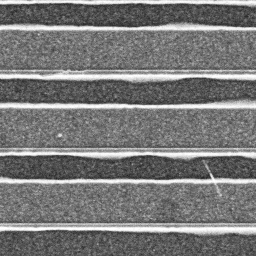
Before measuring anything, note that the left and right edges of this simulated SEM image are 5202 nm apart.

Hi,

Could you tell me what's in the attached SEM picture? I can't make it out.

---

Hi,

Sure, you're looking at lines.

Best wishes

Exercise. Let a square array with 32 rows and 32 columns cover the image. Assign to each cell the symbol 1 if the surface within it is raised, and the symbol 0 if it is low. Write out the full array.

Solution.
00000000000000000000000000000000
00000000000000000000000000000000
00000000000000000000000000000000
11100000000000000000011110000000
11111111111111111111111111111111
11111111111111111111111111111111
11111111111111111111111111111111
11111111111111111111111111111111
11111111111111111111111111111111
00001100000000001110000000000000
00000000000000000000000000000000
00000000000000000000000000000000
00000000000000000000000000000000
11111111111111111111111111111111
11111111111111111111111111111111
11111111111111111111111111111111
11111111111111111111111111111111
11111111111111111111111111111111
11111111111111111111111111111111
00000000000000000000000000000000
00000000000000000000000000000000
00000000000000000000000000000000
00000000000000000000000000000000
11111111111111111111111111111111
11111111111111111111111111111111
11111111111111111111111111111111
11111111111111111111111111111111
11111111111111111111111111111111
01111110111111111111111111111111
00000000000000000000000000000000
00000000000000000000000000000000
00000000000000000000000000000000